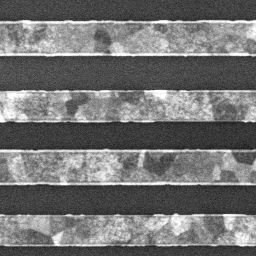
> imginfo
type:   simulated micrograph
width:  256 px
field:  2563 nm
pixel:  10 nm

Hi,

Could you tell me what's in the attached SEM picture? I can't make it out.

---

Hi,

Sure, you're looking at lines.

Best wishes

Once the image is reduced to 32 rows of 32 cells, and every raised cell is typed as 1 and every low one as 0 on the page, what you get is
00000000000000000000000000000000
00000000000000000000000000000000
00000000000000000000000000000000
11111111111111111111111111111111
11111111111111111111111111111111
11111111111111111111111111111111
11111111111111111111111111111111
00000000000000000000000000000000
00000000000000000000000000000000
00000000000000000000000000000000
00000000000000000000000000000000
11111111111111111111111111111111
11111111111111111111111111111111
11111111111111111111111111111111
11111111111111111111111111111111
00000000000000000000000000000000
00000000000000000000000000000000
00000000000000000000000000000000
00000000000000000000000000000000
11111111111111111111111111111111
11111111111111111111111111111111
11111111111111111111111111111111
11111111111111111111111111111111
00000000000000000000000000000000
00000000000000000000000000000000
00000000000000000000000000000000
00000000000000000000000000000000
11111111111111111111111111111111
11111111111111111111111111111111
11111111111111111111111111111111
11111111111111111111111111111111
00000000000000000000000000000000